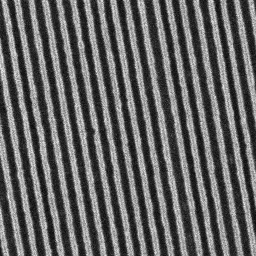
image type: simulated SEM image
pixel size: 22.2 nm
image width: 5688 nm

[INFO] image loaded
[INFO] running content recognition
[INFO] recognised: parallel lines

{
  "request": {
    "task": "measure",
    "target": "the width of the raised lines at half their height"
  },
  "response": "109 nanometres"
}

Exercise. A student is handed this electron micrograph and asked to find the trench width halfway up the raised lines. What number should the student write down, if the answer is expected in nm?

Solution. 175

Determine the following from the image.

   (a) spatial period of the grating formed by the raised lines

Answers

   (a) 0.3 microns